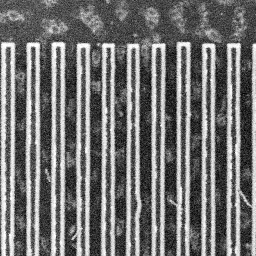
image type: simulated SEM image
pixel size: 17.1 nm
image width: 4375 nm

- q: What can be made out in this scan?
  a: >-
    parallel lines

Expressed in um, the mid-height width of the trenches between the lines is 0.274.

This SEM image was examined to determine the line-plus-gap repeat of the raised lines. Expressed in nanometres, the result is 428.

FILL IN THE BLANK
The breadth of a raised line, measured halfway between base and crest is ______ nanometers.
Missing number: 154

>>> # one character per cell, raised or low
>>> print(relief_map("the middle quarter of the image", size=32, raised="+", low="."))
....++....++....++.....++....++.
....++....++....++.....++....++.
....++....++....++.....++....++.
....++....++....++.....++....++.
....++....++....++.....++....++.
....++....++....++.....++....++.
....++....++....++.....++....++.
....++....++....++.....++....++.
....++....++....++.....++....++.
....++....++....++.....++....++.
....++....++....++.....++....++.
....++....++....++.....++....++.
....++....++....++.....++....++.
....++....++....++.....++....++.
....++....++....++.....++....++.
....++....++....++.....++....++.
....++....++....++.....++....++.
....++....++....++.....++....++.
....++....++....++.....++....++.
....++....++....++.....++....++.
....++....++....++.....++....++.
....++....++....++.....++....++.
....++....++....++.....++....++.
....++....++....++.....++....++.
....++....++....++.....++....++.
....++....++....++.....++....++.
....++....++....++.....++....++.
....++....++....++.....++....++.
....++....++....++.....++....++.
....++....++....++....+++....++.
....++....++....++....++.....++.
....++....++....++....++.....++.